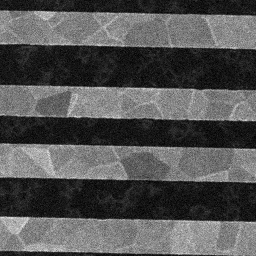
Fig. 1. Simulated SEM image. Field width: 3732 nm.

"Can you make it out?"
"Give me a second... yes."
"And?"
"one or a few lines or trenches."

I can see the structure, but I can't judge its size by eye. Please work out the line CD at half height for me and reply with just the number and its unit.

483 nm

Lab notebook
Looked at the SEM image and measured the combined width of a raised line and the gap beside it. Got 999 nm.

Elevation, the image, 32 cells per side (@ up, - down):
--------------------------------
@@@@@@--------------------------
@@@@@@@@@@@@@@@@@@@@@@@@@@@@@@@@
@@@@@@@@@@@@@@@@@@@@@@@@@@@@@@@@
@@@@@@@@@@@@@@@@@@@@@@@@@@@@@@@@
---@@@@@@@@@@@@@@@@@@@@@@@@@@@@@
--------------------------------
--------------------------------
--------------------------------
--------------------------------
--------------------------------
@@@@@@@@@@@@@@@@@@@@@@@@@@@@@@@@
@@@@@@@@@@@@@@@@@@@@@@@@@@@@@@@@
@@@@@@@@@@@@@@@@@@@@@@@@@@@@@@@@
------@@@@@@@@@@@@@@@@@@@@@@@@@@
--------------------------------
--------------------------------
--------------------------------
@@@@@@@@@@@@@@@@@@@@@@@@@-------
@@@@@@@@@@@@@@@@@@@@@@@@@@@@@@@@
@@@@@@@@@@@@@@@@@@@@@@@@@@@@@@@@
@@@@@@@@@@@@@@@@@@@@@@@@@@@@@@@@
------------------@@@@@@@@@@@@@@
--------------------------------
--------------------------------
--------------------------------
--------------------------------
@@@@@@@@@@@@-@@@@---------------
@@@@@@@@@@@@@@@@@@@@@@@@@@@@@@@@
@@@@@@@@@@@@@@@@@@@@@@@@@@@@@@@@
@@@@@@@@@@@@@@@@@@@@@@@@@@@@@@@@
----------@@-@@@@@@@@@@@@@@@@@@@